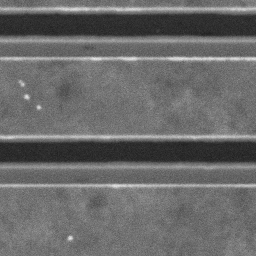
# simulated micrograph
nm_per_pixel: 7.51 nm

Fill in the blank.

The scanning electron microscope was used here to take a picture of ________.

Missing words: lines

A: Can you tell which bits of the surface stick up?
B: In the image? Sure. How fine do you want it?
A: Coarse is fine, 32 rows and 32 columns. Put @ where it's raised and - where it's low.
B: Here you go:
@@@@@@@@@@@@@@@@@@@@@@@@@@@@@@@@
--------------------------------
--------------------------------
--------------------------------
--------------------------------
@@@@@@@@@@@@@@@@@@@@@@@@@@@@@@@@
@@@@@@@@@@@@@@@@@@@@@@@@@@@@@@@@
@@@@@@@@@@@@@@@@@@@@@@@@@@@@@@@@
@@@@@@@@@@@@@@@@@@@@@@@@@@@@@@@@
@@@@@@@@@@@@@@@@@@@@@@@@@@@@@@@@
@@@@@@@@@@@@@@@@@@@@@@@@@@@@@@@@
@@@@@@@@@@@@@@@@@@@@@@@@@@@@@@@@
@@@@@@@@@@@@@@@@@@@@@@@@@@@@@@@@
@@@@@@@@@@@@@@@@@@@@@@@@@@@@@@@@
@@@@@@@@@@@@@@@@@@@@@@@@@@@@@@@@
@@@@@@@@@@@@@@@@@@@@@@@@@@@@@@@@
@@@@@@@@@@@@@@@@@@@@@@@@@@@@@@@@
--------------------------------
--------------------------------
--------------------------------
--------------------------------
@@@@@@@@@@@@@@@@@@@@@@@@@@@@@@@@
@@@@@@@@@@@@@@@@@@@@@@@@@@@@@@@@
@@@@@@@@@@@@@@@@@@@@@@@@@@@@@@@@
@@@@@@@@@@@@@@@@@@@@@@@@@@@@@@@@
@@@@@@@@@@@@@@@@@@@@@@@@@@@@@@@@
@@@@@@@@@@@@@@@@@@@@@@@@@@@@@@@@
@@@@@@@@@@@@@@@@@@@@@@@@@@@@@@@@
@@@@@@@@@@@@@@@@@@@@@@@@@@@@@@@@
@@@@@@@@@@@@@@@@@@@@@@@@@@@@@@@@
@@@@@@@@@@@@@@@@@@@@@@@@@@@@@@@@
@@@@@@@@@@@@@@@@@@@@@@@@@@@@@@@@